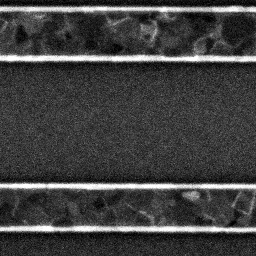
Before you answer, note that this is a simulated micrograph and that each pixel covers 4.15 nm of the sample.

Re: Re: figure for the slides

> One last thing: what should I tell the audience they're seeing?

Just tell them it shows one or a few lines or trenches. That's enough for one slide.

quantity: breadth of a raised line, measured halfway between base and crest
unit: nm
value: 197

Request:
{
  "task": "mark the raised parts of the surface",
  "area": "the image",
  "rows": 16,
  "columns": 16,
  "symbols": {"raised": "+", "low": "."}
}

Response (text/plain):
..............++
++++++++++++++++
++++++++++++++++
++++++++++++++++
................
................
................
................
................
................
................
................
++++++++++++++++
++++++++++++++++
................
................